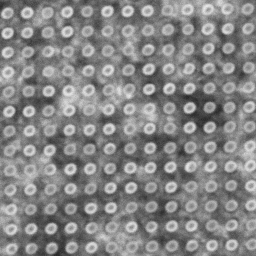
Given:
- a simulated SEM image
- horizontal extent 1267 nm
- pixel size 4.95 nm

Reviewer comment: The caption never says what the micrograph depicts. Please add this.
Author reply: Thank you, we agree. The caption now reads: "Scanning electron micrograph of a regular array of raised bodies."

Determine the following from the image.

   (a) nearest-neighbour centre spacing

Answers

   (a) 96.5 nanometres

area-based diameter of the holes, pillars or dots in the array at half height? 0.0553 micrometres